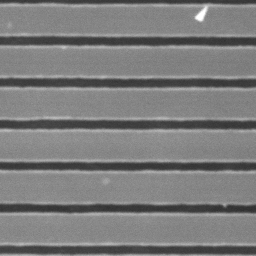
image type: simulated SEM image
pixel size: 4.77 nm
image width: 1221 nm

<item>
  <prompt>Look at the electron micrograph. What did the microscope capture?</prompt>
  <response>parallel lines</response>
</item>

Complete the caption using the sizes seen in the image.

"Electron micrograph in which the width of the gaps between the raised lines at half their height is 47.1 nm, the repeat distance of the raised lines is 41.8 px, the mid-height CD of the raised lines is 151 nm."